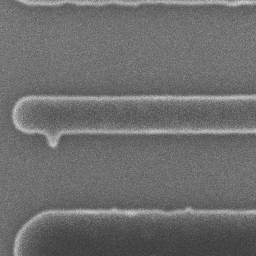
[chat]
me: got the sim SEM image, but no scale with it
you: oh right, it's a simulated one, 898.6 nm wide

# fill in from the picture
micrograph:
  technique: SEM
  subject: one or a few lines or trenches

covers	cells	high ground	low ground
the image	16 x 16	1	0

0000000000000000
0000000000000000
0000000000000000
0000000000000000
0000000000000000
0000000000000000
0111111111111111
0111111111111111
0001000000000000
0000000000000000
0000000000000000
0000000000000000
0000000000000000
0011111111111111
0111111111111111
0111111111111111